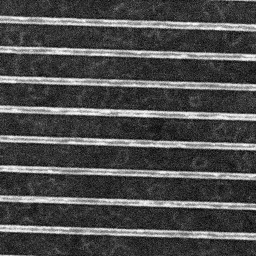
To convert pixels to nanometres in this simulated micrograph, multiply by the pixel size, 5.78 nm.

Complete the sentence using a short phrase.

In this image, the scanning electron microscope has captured parallel lines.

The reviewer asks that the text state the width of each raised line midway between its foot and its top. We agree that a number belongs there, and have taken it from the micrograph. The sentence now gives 0.031 µm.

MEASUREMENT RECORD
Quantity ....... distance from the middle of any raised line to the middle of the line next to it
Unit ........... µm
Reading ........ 0.172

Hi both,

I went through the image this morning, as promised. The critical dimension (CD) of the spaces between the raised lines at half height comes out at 143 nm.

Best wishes